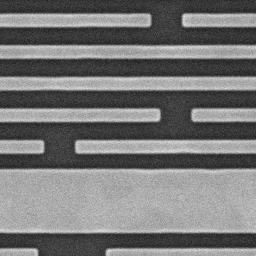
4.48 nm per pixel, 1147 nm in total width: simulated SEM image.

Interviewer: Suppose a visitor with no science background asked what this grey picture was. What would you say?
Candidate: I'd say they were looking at groups of lines, slits or small figures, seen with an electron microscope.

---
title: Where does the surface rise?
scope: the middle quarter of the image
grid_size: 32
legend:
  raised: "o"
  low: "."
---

................................
................................
................................
................................
oooooooooooooooooooooooooooooooo
oooooooooooooooooooooooooooooooo
................................
................................
................................
................................
................................
oooooooooooooooooooooooo........
oooooooooooooooooooooooo........
oooooooooooooooooooooooo........
................................
................................
................................
................................
................................
...ooooooooooooooooooooooooooooo
...ooooooooooooooooooooooooooooo
...ooooooooooooooooooooooooooooo
................................
................................
................................
................................
oo..ooooooooooooooo.....oooooooo
oooooooooooooooooooooooooooooooo
oooooooooooooooooooooooooooooooo
oooooooooooooooooooooooooooooooo
oooooooooooooooooooooooooooooooo
oooooooooooooooooooooooooooooooo